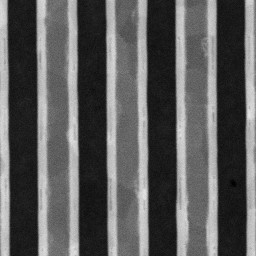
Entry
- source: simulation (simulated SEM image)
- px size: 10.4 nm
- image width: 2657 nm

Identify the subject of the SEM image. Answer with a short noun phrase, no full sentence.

wiring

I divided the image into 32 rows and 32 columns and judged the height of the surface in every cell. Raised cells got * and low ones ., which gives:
.....****.....****.....***.....*
.....****.....****.....***.....*
.....****.....****.....***.....*
.....****.....****.....***.....*
.....****.....****.....***.....*
.....****.....****.....***.....*
.....****.....****.....***.....*
.....****.....****.....***.....*
.....****.....****.....***.....*
.....****.....****.....***.....*
.....****.....****.....***.....*
.....****.....****.....***.....*
.....****.....****.....***.....*
.....****.....****.....***.....*
.....****.....****.....***.....*
.....****.....****.....***.....*
.....****.....****.....***.....*
.....****.....****.....****....*
*....****.....****.....****....*
*....****.....****.....****....*
*....****.....****.....****....*
*....****.....****.....****....*
*....****.....****.....***.....*
.....****.....****.....***.....*
.....****.....****.....***.....*
*.....***.....****.....***......
*....****.....****.....****....*
*....****.....****.....****....*
*....****.....****.....****....*
*....****.....****.....****....*
*....****.....****.....****....*
*.....***.....****.....***.....*